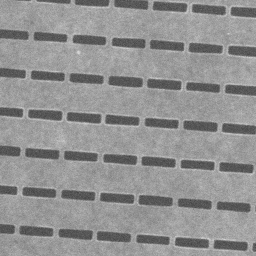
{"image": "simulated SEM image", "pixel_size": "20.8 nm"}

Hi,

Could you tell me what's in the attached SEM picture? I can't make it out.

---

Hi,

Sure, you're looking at an array of small figures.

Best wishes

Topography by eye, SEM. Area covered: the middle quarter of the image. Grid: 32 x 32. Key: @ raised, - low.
@@@@@@@@@@@@@@@@@@@@@@@@@@@@@@@@
@@@@@@@@@@@@@@@@@@@@@@@@@@@@@@@@
@------@@@@@@@@@@@@@@@@@@@@@@@@@
@---------@--------@@---@@@@@@@@
@@--------@---------@--------@@-
@@@@@@@@@@@@--------@-----------
@@@@@@@@@@@@@@@@@@@@@@@@@----@--
@@@@@@@@@@@@@@@@@@@@@@@@@@@@@@@@
@@@@@@@@@@@@@@@@@@@@@@@@@@@@@@@@
@@@@@@@@@@@@@@@@@@@@@@@@@@@@@@@@
@@@@@@@@@@@@@@@@@@@@@@@@@@@@@@@@
@@@@@@@@@@@@@@@@@@@@@@@@@@@@@@@@
@--------@@--@@@@@@@@@@@@@@@@@@@
-------------------@-----@@@@@@@
@------------------@---------@--
@@@@@@@@@@@@@@----@@---------@--
@@@@@@@@@@@@@@@@@@@@@@@@@@@@@@--
@@@@@@@@@@@@@@@@@@@@@@@@@@@@@@@@
@@@@@@@@@@@@@@@@@@@@@@@@@@@@@@@@
@@@@@@@@@@@@@@@@@@@@@@@@@@@@@@@@
@@@@@@@@@@@@@@@@@@@@@@@@@@@@@@@@
@@@@@@@@@@@@@@@@@@@@@@@@@@@@@@@@
--------@@-----@@@@@@@@@@@@@@@@@
---------@--------@---------@@@@
@@@@----@@--------@---------@---
@@@@@@@@@@@@@@@@@-@@--------@---
@@@@@@@@@@@@@@@@@@@@@@@@@@@@@@@@
@@@@@@@@@@@@@@@@@@@@@@@@@@@@@@@@
@@@@@@@@@@@@@@@@@@@@@@@@@@@@@@@@
@@@@@@@@@@@@@@@@@@@@@@@@@@@@@@@@
@@@@@@@@@@@@@@@@@@@@@@@@@@@@@@@@
----@@@@@@@@@@@@@@@@@@@@@@@@@@@@